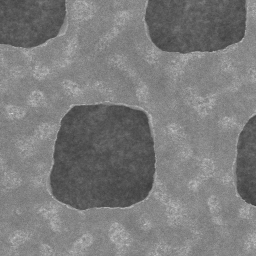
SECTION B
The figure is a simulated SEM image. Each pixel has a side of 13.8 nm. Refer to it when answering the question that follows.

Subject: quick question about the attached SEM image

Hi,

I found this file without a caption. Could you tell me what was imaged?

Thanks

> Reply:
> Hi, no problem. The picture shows holes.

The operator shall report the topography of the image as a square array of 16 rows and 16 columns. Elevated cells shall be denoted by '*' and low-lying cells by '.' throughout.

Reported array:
....*****......*
....*****......*
...******......*
****************
****************
****************
******.*********
****.....*******
****......*****.
***.......*****.
***.......*****.
***.......*****.
****.....******.
****************
****************
****************